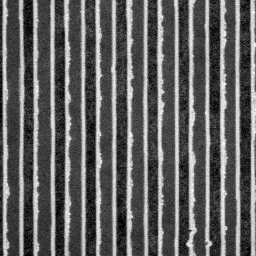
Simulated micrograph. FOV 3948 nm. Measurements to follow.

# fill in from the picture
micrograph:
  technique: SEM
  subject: parallel lines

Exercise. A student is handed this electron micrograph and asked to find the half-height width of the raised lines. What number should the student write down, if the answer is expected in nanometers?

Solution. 256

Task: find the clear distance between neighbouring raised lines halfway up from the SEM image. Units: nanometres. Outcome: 218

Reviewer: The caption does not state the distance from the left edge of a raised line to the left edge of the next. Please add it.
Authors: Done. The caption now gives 478 nanometers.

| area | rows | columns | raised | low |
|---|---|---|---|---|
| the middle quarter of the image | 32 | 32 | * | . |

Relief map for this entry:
.****....***....****....****....
.****....***....****....****....
.****....***....****....****....
.****....***....****....****....
.****....***....****....****....
.****....***....****....****....
.****....***....****....****....
.****....***....****....****....
.****....***....****....****....
.****....***....****....****....
.****....***....****....****....
.****....***....****....****....
.****....***.....***....****....
.****....***.....***....****....
.****....***.....***....****....
.****....***.....***....****....
.****....***.....***....****....
.****...****....****....****....
.****...****....****....****....
.****...****....****....****....
.****...****....****....****....
.****...****....****....****....
.****...****....****....****....
.****...****....****....****....
.****....***....****....****....
.****...****....****....****....
.****...****....****....****....
.****...****....****....****....
.****...****....****....****....
.****...****....****....****....
.****...****....****....****....
.****...****....****....****....